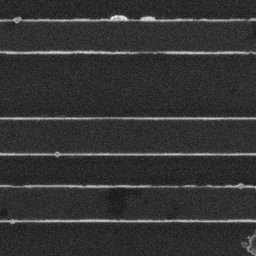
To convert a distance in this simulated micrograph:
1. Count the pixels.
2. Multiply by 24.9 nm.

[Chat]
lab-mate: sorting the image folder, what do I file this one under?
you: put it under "lines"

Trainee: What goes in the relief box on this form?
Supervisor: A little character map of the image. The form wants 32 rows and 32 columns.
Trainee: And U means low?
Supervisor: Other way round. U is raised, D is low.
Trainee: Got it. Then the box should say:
DDDDDDDDDDDDDDDDDDDDDDDDDDDDDDDD
DDDDDDDDDDDDDDDDDDDDDDDDDDDDDDDD
DUUDDDDDDDDDDDDDDDDDDDDDDDDDDDDD
UUUUUUUUUUUUUUUUUUUUUUUUUUUUUUUU
UUUUUUUUUUUUUUUUUUUUUUUUUUUUUUUU
UUUUUUUUUUUUUUUUUUUUUUUUUUUUUUUU
UUUUUUUUUUUUUUUUUUUUUUUUUUUUUUUU
DDDDDDDDDDDDDDDDDDDDDDDDDDDDDDDD
DDDDDDDDDDDDDDDDDDDDDDDDDDDDDDDD
DDDDDDDDDDDDDDDDDDDDDDDDDDDDDDDD
DDDDDDDDDDDDDDDDDDDDDDDDDDDDDDDD
DDDDDDDDDDDDDDDDDDDDDDDDDDDDDDDD
DDDDDDDDDDDDDDDDDDDDDDDDDDDDDDDD
DDDDDDDDDDDDDDDDDDDDDDDDDDDDDDDD
DDDDDDDDDDDDDDDDDDDDDDDDDDDDDDDD
UUUUUUUUUUUUUUUUUUUUUUUUUUUUUUUU
UUUUUUUUUUUUUUUUUUUUUUUUUUUUUUUU
UUUUUUUUUUUUUUUUUUUUUUUUUUUUUUUU
UUUUUUUUUUUUUUUUUUUUUUUUUUUUUUUU
DDDDDDDDDDDDDDDDDDDDDDDDDDDDDDDD
DDDDDDDDDDDDDDDDDDDDDDDDDDDDDDDD
DDDDDDDDDDDDDDDDDDDDDDDDDDDDDDDD
DDDDDDDDDDDDDDDDDDDDDDDDDDDDDDDD
UUUUUUUUUUUUUUUUUUUUUUUUUUUUUUUU
UUUUUUUUUUUUUUUUUUUUUUUUUUUUUUUU
UUUUUUUUUUUUUUUUUUUUUUUUUUUUUUUU
UUUUUUUUUUUUUUUUUUUUUUUUUUUUUUUU
UUUUUUUUUUUUUUUUUUUUUUUUUUUUUUUU
DDDDDDDDDDDDDDDDDDDDDDDDDDDDDDDD
DDDDDDDDDDDDDDDDDDDDDDDDDDDDDDDD
DDDDDDDDDDDDDDDDDDDDDDDDDDDDDDDD
DDDDDDDDDDDDDDDDDDDDDDDDDDDDDDDD